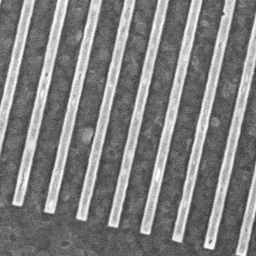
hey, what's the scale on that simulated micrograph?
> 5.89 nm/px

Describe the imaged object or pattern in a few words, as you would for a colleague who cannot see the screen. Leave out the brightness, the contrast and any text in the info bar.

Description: parallel lines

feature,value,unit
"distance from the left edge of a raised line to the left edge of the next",192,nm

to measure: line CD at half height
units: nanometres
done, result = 50.9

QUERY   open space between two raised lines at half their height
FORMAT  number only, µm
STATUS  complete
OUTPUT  0.141